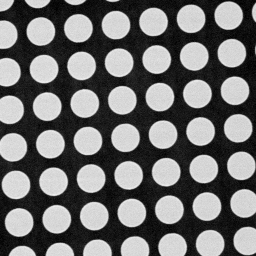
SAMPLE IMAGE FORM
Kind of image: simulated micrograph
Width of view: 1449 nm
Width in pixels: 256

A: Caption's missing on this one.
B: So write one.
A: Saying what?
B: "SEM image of an array of small figures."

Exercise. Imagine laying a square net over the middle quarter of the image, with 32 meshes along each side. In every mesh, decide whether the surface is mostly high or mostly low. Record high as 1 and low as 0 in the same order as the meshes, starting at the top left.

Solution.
01111111001111111000111111000011
01111111000111111000011111000000
00111110000011110000000000000000
00111100000000000000000000000000
00000000000000000000000000000001
00000000000000000000001111000011
00001100000011111000011111100011
00011111000111111100011111100011
00111111000111111100111111100011
00111111100111111100011111100001
00111111100111111100011111100000
00111111000011111000000110000000
00011111000000100000000000000000
00000000000000000000000000000000
00000000000000000000000111000001
00000000000001111000001111110001
00001111000011111100011111110001
00011111100011111110011111110001
00011111100011111110011111110001
00111111100011111110001111110000
00011111100001111100000111100000
00011111100000111000000000000000
00000110000000000000000000000000
00000000000000000000000000000000
00000000000000011000000111110000
00000111000000111110001111111000
00001111110001111110001111111001
00011111110001111111001111111000
10011111110001111111001111111000
10011111110001111110000111110000
10001111110000111100000001000000
00000111100000000000000000000000